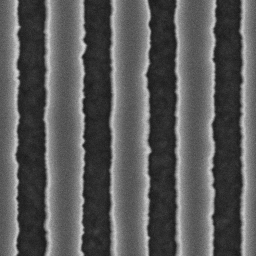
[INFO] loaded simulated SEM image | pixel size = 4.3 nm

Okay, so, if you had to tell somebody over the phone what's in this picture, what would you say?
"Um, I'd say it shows lines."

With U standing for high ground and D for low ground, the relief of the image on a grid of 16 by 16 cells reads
UDDUUDDUUDDUUDDU
UDDUUDDUUDDUUDDU
UDDUUDDUUDDUUDDU
UDDUUDDUUDDUUDDU
UDDUUDDUUDDUUDDU
UDDUUDDUUDDUUDDU
UDDUUDDUUDDUUDDU
UDDUUDDUUDDUUDDU
UDDUUDDUUDDUUDDU
UDDUUDDUUDDUUDDU
UDDUUDDUUDDUUDDU
UDDUUDDUUDDUUDDU
UDDUUDDUUDDUUDDU
UDDUUDDUUDDUUDDU
UDDUUDDUUDDUUDDU
UDDUUDDUUDDUUDDU